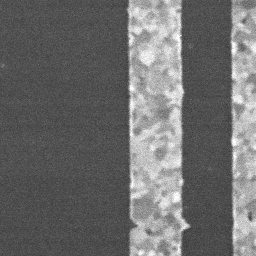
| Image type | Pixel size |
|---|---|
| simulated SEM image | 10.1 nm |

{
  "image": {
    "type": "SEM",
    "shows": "one or a few lines or trenches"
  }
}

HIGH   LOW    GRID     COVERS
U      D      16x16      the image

DDDDDDDDUUUDDDDU
DDDDDDDDUUUDDDDU
DDDDDDDDUUUDDDDU
DDDDDDDDUUUDDDDU
DDDDDDDDUUUDDDDU
DDDDDDDDUUUDDDDU
DDDDDDDDUUUDDDDU
DDDDDDDDUUUDDDDU
DDDDDDDDUUUDDDDU
DDDDDDDDUUUDDDDU
DDDDDDDDUUUDDDDU
DDDDDDDDUUUDDDDU
DDDDDDDDUUUDDDDU
DDDDDDDDUUUDDDDU
DDDDDDDDUUUDDDDU
DDDDDDDDUUUDDDDU